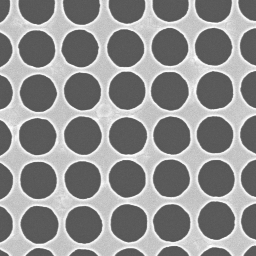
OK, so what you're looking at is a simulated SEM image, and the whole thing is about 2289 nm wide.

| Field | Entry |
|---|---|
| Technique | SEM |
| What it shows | a regular array of holes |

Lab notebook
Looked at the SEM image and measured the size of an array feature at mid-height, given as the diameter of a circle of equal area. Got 337 nm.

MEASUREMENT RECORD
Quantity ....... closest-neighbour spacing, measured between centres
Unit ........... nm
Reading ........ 384